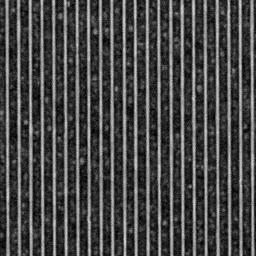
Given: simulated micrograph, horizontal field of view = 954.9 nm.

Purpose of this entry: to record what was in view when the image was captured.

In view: parallel lines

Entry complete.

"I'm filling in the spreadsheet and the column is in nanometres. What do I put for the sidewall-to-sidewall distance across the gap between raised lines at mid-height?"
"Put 36.4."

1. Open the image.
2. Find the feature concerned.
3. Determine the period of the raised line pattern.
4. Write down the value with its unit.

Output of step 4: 43.5 nm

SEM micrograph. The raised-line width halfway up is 7.5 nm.